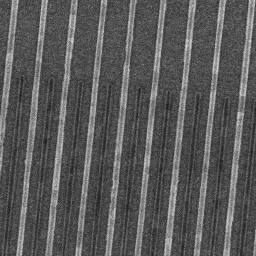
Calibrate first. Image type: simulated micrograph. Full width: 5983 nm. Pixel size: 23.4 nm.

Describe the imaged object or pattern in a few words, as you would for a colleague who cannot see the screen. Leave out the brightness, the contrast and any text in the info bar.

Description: parallel lines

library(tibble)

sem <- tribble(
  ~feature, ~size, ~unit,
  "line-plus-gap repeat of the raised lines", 344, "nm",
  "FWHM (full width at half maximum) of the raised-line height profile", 0.113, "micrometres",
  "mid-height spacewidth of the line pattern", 227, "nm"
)